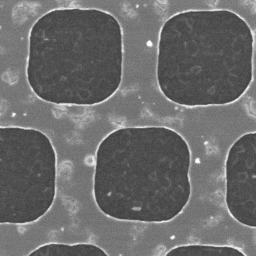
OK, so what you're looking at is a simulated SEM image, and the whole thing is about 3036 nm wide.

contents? holes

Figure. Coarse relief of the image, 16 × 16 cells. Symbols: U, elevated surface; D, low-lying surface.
UUUUUUUUUUUUUUUU
UUDDDDDUUUDDDDDU
UUDDDDDDUUDDDDDD
UUDDDDDDUUDDDDDD
UUDDDDDDUUDDDDDD
UUDDDDDUUUDDDDDU
UUUUUDUUUUUDDDUU
UUUUUUUUUUUUUUUU
DDDUUUUDDDDUUUUD
DDDUUUDDDDDDUUDD
DDDUUUDDDDDDUUDD
DDDUUUDDDDDDUUDD
DDDUUUDDDDDDUUDD
DDDUUUUDDDDUUUUD
UUUUUUUUUUUUUUUU
UUDDDDUUUUUDDDUU